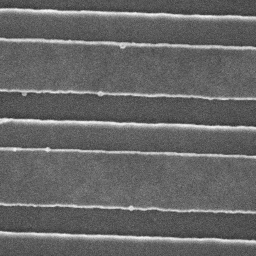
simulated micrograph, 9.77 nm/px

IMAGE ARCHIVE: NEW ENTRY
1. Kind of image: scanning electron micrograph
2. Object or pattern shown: lines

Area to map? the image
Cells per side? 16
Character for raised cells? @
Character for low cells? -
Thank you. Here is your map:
----------------
----------------
@@@-------------
@@@@@@@@@@@@@@@@
@@@@@@@@@@@@@@@@
@@@@@@@@@@@@@@@@
----------------
----------------
----------------
@@@@@@@@@-------
@@@@@@@@@@@@@@@@
@@@@@@@@@@@@@@@@
@@@@@@@@@@@@@@@@
----------------
----------------
----------------